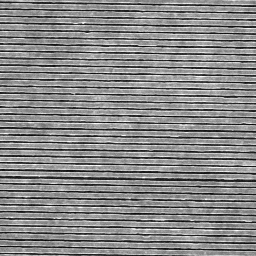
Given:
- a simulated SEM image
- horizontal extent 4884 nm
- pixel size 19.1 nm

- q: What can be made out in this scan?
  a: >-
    parallel lines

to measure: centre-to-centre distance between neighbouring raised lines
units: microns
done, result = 0.133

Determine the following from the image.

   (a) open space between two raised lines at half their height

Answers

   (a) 42.9 nanometres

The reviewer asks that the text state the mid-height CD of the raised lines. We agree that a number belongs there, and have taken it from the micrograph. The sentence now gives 100 nm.